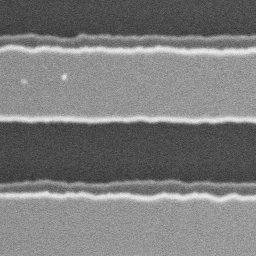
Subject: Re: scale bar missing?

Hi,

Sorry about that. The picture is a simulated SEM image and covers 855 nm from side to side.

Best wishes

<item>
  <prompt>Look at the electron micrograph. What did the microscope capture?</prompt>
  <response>lines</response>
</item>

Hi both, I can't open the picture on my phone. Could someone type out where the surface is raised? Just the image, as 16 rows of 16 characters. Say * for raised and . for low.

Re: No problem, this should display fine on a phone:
................
................
................
****************
****************
****************
****************
****************
................
................
................
................
****************
****************
****************
****************